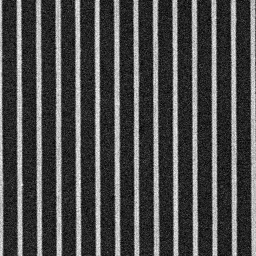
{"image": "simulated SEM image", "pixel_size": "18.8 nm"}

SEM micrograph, parallel lines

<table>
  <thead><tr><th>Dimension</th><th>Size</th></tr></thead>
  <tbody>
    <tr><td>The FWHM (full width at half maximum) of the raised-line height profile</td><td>68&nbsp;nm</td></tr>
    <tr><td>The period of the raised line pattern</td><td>365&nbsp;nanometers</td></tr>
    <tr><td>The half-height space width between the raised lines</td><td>298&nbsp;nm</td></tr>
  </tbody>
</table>